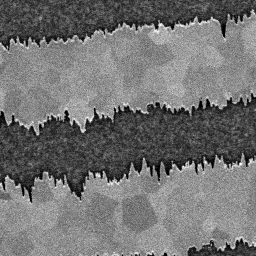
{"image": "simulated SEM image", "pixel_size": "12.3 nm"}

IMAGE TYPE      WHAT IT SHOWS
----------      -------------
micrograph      one or a few lines or trenches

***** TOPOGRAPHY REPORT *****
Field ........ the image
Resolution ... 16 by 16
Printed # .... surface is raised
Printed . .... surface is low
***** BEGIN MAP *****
................
............####
....############
################
################
################
##############..
.##..#..........
................
................
...........#####
#.##.###########
################
################
################
############....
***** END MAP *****